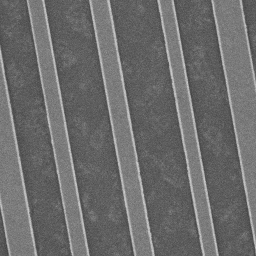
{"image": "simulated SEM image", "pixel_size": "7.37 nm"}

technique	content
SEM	one or a few lines or trenches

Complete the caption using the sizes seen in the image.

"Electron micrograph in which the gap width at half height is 332 nanometres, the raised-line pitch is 465 nanometres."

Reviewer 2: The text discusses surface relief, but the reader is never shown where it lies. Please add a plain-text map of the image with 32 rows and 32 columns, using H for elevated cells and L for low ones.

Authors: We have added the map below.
LLLHHHLLLLLHHHLLLLLLHHLLLLLHHHLL
LLLLHHLLLLLHHHLLLLLLHHLLLLLHHHLL
LLLLHHLLLLLLHHLLLLLLHHLLLLLHHHHL
LLLLHHLLLLLLHHLLLLLLHHLLLLLHHHHL
LLLLHHLLLLLLHHLLLLLLLHLLLLLHHHHL
LLLLHHLLLLLLHHHLLLLLLHHLLLLHHHHL
LLLLLHHLLLLLHHHLLLLLLHHLLLLLHHHL
LLLLLHHLLLLLLHHLLLLLLHHLLLLLHHHL
LLLLLHHLLLLLLHHLLLLLLHHLLLLLHHHH
HLLLLHHLLLLLLHHLLLLLLHHLLLLLHHHH
HLLLLHHLLLLLLHHLLLLLLLHLLLLLHHHH
HLLLLHHLLLLLLHHHLLLLLLHHLLLLLHHH
HLLLLLHHLLLLLHHHLLLLLLHHLLLLLHHH
HLLLLLHHLLLLLLHHLLLLLLHHLLLLLHHH
HLLLLLHHLLLLLLHHLLLLLLHHLLLLLHHH
HHLLLLHHLLLLLLHHLLLLLLHHLLLLLHHH
HHLLLLHHLLLLLLHHLLLLLLLHLLLLLHHH
HHLLLLHHHLLLLLHHHLLLLLLHHLLLLLHH
HHLLLLLHHLLLLLHHHLLLLLLHHLLLLLHH
HHLLLLLHHLLLLLLHHLLLLLLHHLLLLLHH
HHHLLLLHHLLLLLLHHLLLLLLHHLLLLLHH
HHHLLLLHHLLLLLLHHLLLLLLLHLLLLLHH
HHHLLLLHHLLLLLLHHHLLLLLLHHLLLLHH
HHHLLLLLHHLLLLLHHHLLLLLLHHLLLLLH
HHHLLLLLHHLLLLLLHHLLLLLLHHLLLLLH
HHHLLLLLHHLLLLLLHHLLLLLLHHLLLLLH
HHHHLLLLHHLLLLLLHHLLLLLLHHLLLLLH
HHHHLLLLHHLLLLLLHHLLLLLLLHLLLLLH
LHHHLLLLHHLLLLLLHHHLLLLLLHHLLLLL
LHHHLLLLLHHLLLLLHHHLLLLLLHHLLLLL
LHHHLLLLLHHLLLLLLHHLLLLLLHHLLLLL
LHHHLLLLLHHLLLLLLHHLLLLLLHHLLLLL